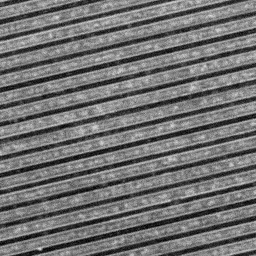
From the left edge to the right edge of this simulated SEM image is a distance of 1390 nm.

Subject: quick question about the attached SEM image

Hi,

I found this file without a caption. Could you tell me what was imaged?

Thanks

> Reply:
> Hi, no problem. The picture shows parallel lines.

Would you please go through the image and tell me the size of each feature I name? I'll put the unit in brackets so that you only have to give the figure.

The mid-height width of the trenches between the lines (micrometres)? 0.0324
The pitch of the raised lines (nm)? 90.1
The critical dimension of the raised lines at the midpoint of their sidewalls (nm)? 58.9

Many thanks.